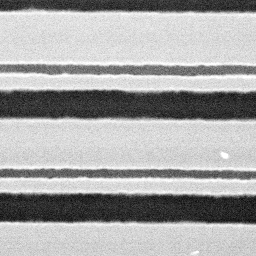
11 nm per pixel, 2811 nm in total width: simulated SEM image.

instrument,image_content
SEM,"lines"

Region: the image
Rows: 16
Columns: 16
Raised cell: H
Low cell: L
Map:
LLLLLLLLLLLLLLLL
HHHHHHHHHHHHHHHH
HHHHHHHHHHHHHHHH
HHHHHHHHHHHHHHHH
HHHHHHHHHHHHHHHH
HHHHHHHHHHHHHHHH
LLLLLLLLLLLLLLLL
LLLLLLLLLLLLLLLL
HHHHHHHHHHHHHHHH
HHHHHHHHHHHHHHHH
HHHHHHHHHHHHHHHH
HHHHHHHHHHHHHHHH
LLLLLLLLLLLLLLLL
LLLLLLLLLLLLLLLL
HHHHHHHHHHHHHHHH
HHHHHHHHHHHHHHHH